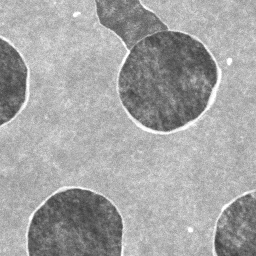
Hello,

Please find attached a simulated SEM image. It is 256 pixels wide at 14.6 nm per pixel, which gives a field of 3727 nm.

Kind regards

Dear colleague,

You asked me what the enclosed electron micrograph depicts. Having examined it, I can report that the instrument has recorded holes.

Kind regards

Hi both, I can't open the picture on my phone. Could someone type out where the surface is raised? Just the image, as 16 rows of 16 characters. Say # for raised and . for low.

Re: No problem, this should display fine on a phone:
######...#######
######....######
########....####
.#######.....###
..#####.......##
..#####......###
.#######.....###
.#######....####
################
################
################
################
###....########.
##......######..
##......#####...
##......#####...